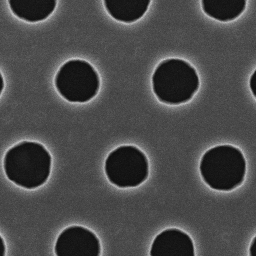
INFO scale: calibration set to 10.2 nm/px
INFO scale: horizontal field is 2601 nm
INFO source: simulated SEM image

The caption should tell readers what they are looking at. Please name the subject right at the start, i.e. holes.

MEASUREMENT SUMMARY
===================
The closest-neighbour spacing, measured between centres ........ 986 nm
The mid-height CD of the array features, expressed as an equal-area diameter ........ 462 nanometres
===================